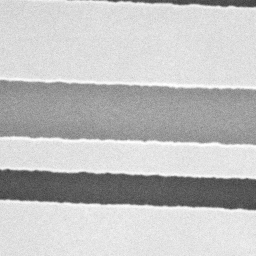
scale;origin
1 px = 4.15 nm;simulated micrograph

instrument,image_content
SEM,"lines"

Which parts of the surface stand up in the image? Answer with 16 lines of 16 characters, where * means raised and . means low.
***************.
****************
****************
****************
****************
...............*
................
................
................
****************
****************
................
................
****************
****************
****************